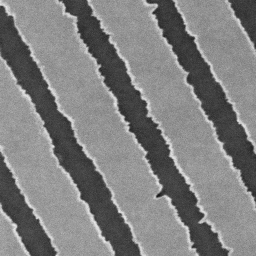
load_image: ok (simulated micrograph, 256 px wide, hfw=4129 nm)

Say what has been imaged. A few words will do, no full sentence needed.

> one or a few lines or trenches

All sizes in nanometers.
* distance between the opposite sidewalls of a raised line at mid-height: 761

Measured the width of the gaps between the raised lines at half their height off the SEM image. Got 0.418 microns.